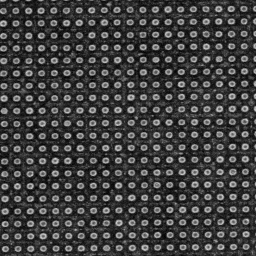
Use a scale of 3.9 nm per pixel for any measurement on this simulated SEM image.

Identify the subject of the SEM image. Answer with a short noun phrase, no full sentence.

a regular array of raised bodies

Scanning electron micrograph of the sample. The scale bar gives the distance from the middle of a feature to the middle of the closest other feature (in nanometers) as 48.4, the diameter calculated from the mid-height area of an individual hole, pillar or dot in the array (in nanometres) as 23.7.